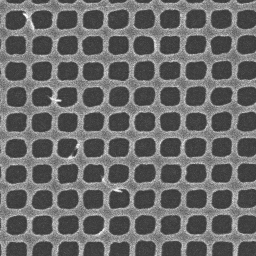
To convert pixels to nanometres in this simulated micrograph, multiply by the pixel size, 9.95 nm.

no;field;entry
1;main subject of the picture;a regular array of holes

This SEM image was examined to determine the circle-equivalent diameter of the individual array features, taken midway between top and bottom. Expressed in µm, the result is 0.211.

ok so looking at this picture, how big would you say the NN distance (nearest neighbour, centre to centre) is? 0.252 um